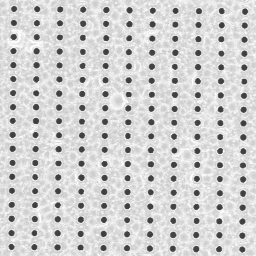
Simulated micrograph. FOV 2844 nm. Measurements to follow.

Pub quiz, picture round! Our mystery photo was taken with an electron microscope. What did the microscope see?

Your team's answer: a regular array of holes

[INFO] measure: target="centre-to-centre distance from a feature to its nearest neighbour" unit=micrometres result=0.152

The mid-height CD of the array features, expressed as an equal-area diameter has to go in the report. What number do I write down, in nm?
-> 69.8